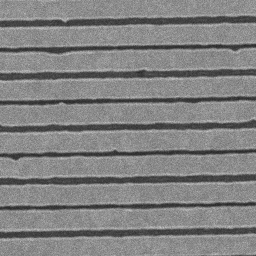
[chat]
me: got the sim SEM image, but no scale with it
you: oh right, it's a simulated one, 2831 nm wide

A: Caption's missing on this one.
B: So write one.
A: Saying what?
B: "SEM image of parallel lines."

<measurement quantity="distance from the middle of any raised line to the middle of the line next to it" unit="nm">290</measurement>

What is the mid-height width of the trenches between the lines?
88.5 nm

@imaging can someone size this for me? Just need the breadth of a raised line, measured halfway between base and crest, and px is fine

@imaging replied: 19.5